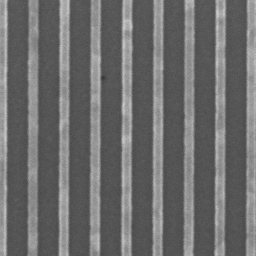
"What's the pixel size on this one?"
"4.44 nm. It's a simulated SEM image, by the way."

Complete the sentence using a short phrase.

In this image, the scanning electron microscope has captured parallel lines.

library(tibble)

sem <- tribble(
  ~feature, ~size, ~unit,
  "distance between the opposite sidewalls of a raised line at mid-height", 0.0377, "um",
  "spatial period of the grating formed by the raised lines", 0.138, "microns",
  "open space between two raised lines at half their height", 101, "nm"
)